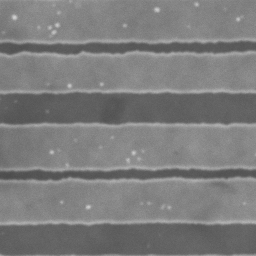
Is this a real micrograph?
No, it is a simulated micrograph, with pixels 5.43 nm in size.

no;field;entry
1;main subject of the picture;lines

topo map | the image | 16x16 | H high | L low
HHHHHHHHHHHHHHHH
HHHHHHHHHHHHHHHH
HHHHHHHHHHHHHHHH
HHHHHHHHHHHHHHHH
HHHHHHHHHHHHHHHH
HHHHHHHHHHHHHHHH
LLLLLLLLLLLLLLLL
LLLLLLLLLLLLLLLL
HHHHHHHHHHHHHHHH
HHHHHHHHHHHHHHHH
HHHHHHHHHHHHHHHH
HHHHHHHHHHHHHHHH
HHHHHHHHHHHHHHHH
HHHHHHHHHHHHHHHH
LLLLLLLLLLLLLLLL
LLLLLLLLLLLLLLLL